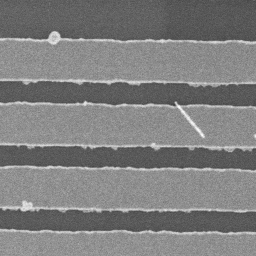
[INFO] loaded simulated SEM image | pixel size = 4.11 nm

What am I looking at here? lines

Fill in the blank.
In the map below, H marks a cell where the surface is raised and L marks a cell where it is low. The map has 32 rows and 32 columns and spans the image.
LLLLLLLLLLLLLLLLLLLLLLLLLLLLLLLL
LLLLLLLLLLLLLLLLLLLLLLLLLLLLLLLL
LLLLLLLLLLLLLLLLLLLLLLLLLLLLLLLL
LLLLLLLLLLLLLLLLLLLLLLLLLLLLLLLL
LLLLLLHHLLLLLLLLLLLLLLLLLLLLLLLL
HHHHHHHHHHHHHHHHHHHHHHHHHHHHHHHH
HHHHHHHHHHHHHHHHHHHHHHHHHHHHHHHH
HHHHHHHHHHHHHHHHHHHHHHHHHHHHHHHH
HHHHHHHHHHHHHHHHHHHHHHHHHHHHHHHH
HHHHHHHHHHHHHHHHHHHHHHHHHHHHHHHH
LLLLLLLLLLLLLLLLLLLLLLLLLLLLLLLL
LLLLLLLLLLLLLLLLLLLLLLLLLLLLLLLL
LLLLLLLLLLLLLLLLLLLLLLLLLLLLLLLL
HHHHHHHHHHHHHHHHHHHHHHHHHHHHHHHH
HHHHHHHHHHHHHHHHHHHHHHHHHHHHHHHH
HHHHHHHHHHHHHHHHHHHHHHHHHHHHHHHH
HHHHHHHHHHHHHHHHHHHHHHHHHHHHHHHH
HHHHHHHHHHHHHHHHHHHHHHHHHHHHHHHH
LLLLLLLLLLLLLLLLLLLLLLLLLLLLLLLL
LLLLLLLLLLLLLLLLLLLLLLLLLLLLLLLL
LLLLLLLLLLLLLLLLLLLLLLLLLLLLLLLL
HHHHHHHHHHHHHHHHHHHHHHHHHHHHHHHH
HHHHHHHHHHHHHHHHHHHHHHHHHHHHHHHH
HHHHHHHHHHHHHHHHHHHHHHHHHHHHHHHH
HHHHHHHHHHHHHHHHHHHHHHHHHHHHHHHH
HHHHHHHHHHHHHHHHHHHHHHHHHHHHHHHH
LLLLLLLLLLLLLLLLLLLLLLLLLLLLLLLL
LLLLLLLLLLLLLLLLLLLLLLLLLLLLLLLL
LLLLLLLLLLLLLLLLLLLLLLLLLLLLLLLL
HHHHHHHHHHHHHHHHHHHHHHHHHHHHHHHH
HHHHHHHHHHHHHHHHHHHHHHHHHHHHHHHH
HHHHHHHHHHHHHHHHHHHHHHHHHHHHHHHH